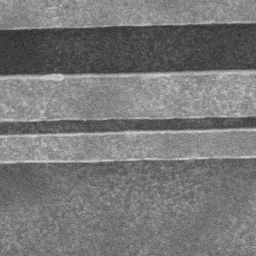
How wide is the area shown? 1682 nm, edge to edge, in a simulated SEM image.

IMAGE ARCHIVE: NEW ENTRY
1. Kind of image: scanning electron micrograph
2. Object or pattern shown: lines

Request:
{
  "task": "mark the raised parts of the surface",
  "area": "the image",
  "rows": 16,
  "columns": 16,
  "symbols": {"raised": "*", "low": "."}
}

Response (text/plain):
****************
************....
................
................
................
****************
****************
****************
****************
****************
................
................
................
................
................
................